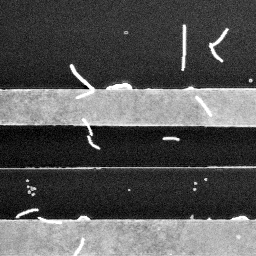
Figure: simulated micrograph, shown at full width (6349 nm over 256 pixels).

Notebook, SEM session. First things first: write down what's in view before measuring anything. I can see lines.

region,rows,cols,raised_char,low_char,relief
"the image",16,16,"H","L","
LLLLLLLLLLLLLLLL
LLLLLLLLLLLLLLLL
LLLLLLLLLLLLLLLL
LLLLLLLLLLLLLLLL
LLLLLLLLLLLLLLLL
LLLLLLLLLLLLLLLL
HHHHHHHHHHHHHHHH
HHHHHHHHHHHHHHHH
LLLLLLLLLLLLLLLL
LLLLLLLLLLLLLLLL
LLLLLLLLLLLLLLLL
LLLLLLLLLLLLLLLL
LLLLLLLLLLLLLLLL
LLLLLLLLLLLLLLLL
HHHHHHHHHHHHHHHH
HHHHHHHHHHHHHHHH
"